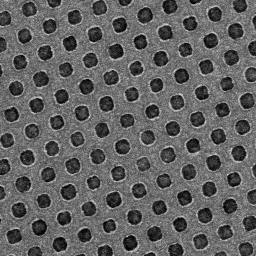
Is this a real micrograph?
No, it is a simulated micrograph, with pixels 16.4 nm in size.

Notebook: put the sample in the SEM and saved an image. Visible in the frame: a regular array of holes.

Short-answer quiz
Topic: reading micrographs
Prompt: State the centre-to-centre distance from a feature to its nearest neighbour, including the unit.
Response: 430 nanometres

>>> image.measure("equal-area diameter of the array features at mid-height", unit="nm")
253